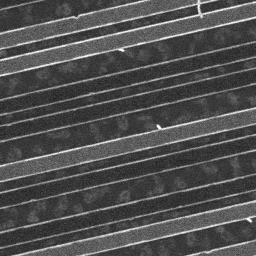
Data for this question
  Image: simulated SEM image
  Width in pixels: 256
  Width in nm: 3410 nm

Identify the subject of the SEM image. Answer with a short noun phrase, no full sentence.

parallel lines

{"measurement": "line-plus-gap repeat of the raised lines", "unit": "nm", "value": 428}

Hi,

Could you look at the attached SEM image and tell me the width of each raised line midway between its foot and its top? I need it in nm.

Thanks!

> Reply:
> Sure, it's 208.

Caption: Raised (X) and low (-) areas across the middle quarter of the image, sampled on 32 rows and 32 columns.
---------------------XXXXXXXXXXX
----------------XXXXXXXXXXXXXXXX
------------XXXXXXXXXXXXXXXXXX--
--------XXXXXXXXXXXXXXXXXX------
---XXXXXXXXXXXXXXXXXX-----------
XXXXXXXXXXXXXXXXX-----------XXXX
XXXXXXXXXXXX------------XXXXXXXX
XXXXXXX------------XXXXXXXXXXXXX
XXX------------XXXXXXXXXXXXXXXXX
----------XXXXXXXXXXXXXXXXXXX---
------XXXXXXXXXXXXXXXXXX--------
--XXXXXXXXXXXXXXXXX-------------
XXXXXXXXXXXXXX------------------
XXXXXXXXXX----------------------
XXXXXX--------------------------
X---------------------------XXXX
-----------------------XXXXXXXXX
-------------------XXXXXXXXXXXXX
---------------XXXXXXXXXXXXXXXXX
----------XXXXXXXXXXXXXXXXXX----
------XXXXXXXXXXXXXXXXX---------
--XXXXXXXXXXXXXXXXX------------X
XXXXXXXXXXXXXX-------------XXXXX
XXXXXXXXXX------------XXXXXXXXXX
XXXXXX------------XXXXXXXXXXXXXX
X------------XXXXXXXXXXXXXXXXXX-
---------XXXXXXXXXXXXXXXXX------
-----XXXXXXXXXXXXXXXXX----------
XXXXXXXXXXXXXXXXX---------------
XXXXXXXXXXXXX-------------------
XXXXXXXXX--------------------X--
XXXX--------------------------XX